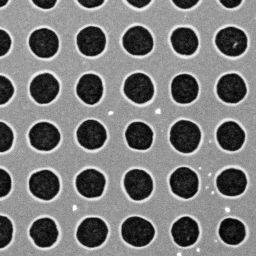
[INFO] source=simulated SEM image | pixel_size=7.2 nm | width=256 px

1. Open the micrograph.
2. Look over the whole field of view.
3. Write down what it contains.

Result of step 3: a regular array of holes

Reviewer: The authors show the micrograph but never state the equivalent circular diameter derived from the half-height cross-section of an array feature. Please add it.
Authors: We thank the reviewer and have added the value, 221 nm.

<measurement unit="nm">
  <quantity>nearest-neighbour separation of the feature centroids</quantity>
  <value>331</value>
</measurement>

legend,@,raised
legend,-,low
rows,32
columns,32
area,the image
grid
-@@@---@@@---@@@---@@@---@@@--@@
@@@@@@@@@@@@@@@@@@@@@@@@@@@@@@@@
@@@@@@@@@@@@@@@@@@@@@@@@@@@@@@@@
@@@@@-@@@@@-@@@@--@@@@--@@@@--@@
-@@@---@@@---@@----@@----@@----@
-@@@---@@@---@@----@@----@@----@
-@@@---@@@---@@@---@@@--@@@@---@
@@@@@@@@@@@@@@@@@@@@@@@@@@@@@@@@
@@@@@@@@@@@@@@@@@@@@@@@@@@@@@@@@
-@@@---@@@--@@@@--@@@@--@@@@--@@
--@@---@@@---@@----@@----@@----@
--@@---@@@---@@----@@----@@----@
-@@@---@@@--@@@@---@@@--@@@@--@@
@@@@@@@@@@@@@@@@@@@@@@@@@@@@@@@@
@@@@@@@@@@@@@@@@@@@@@@@@@@@@@@@@
-@@@@--@@@---@@@--@@@@--@@@@--@@
--@@---@@@---@@@---@@----@@----@
--@@----@@---@@@---@@----@@----@
-@@@---@@@@-@@@@---@@@---@@@--@@
@@@@@@@@@@@@@@@@@@@@@@@@@@@@@@@@
@@@@@@@@@@@@@@@@@@@@@@@@@@@@@@@@
-@@@---@@@---@@@--@@@@--@@@@--@@
-@@@---@@----@@----@@----@@----@
-@@@---@@@---@@@---@@----@@----@
-@@@---@@@---@@@---@@@--@@@@--@@
@@@@@@@@@@@@@@@@@@@@@@@@@@@@@@@@
@@@@@@@@@@@@@@@@@@@@@@@@@@@@@@@@
-@@@@--@@@---@@@--@@@@--@@@@--@@
--@@---@@@----@----@@----@@----@
--@@---@@@---@@----@@@---@@----@
-@@@---@@@---@@@--@@@@--@@@@--@@
@@@@@@@@@@@@@@@@@@@@@@@@@@@@@@@@